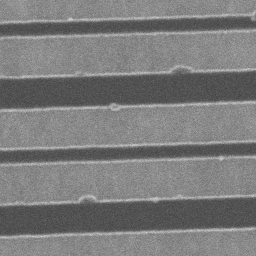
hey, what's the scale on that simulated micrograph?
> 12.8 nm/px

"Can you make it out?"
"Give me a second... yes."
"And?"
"lines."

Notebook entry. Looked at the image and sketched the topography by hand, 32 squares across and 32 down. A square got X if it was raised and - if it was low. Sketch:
--------------------------------
--------------------------------
--------X-XXXXXXXXXXXXXXXXXXXXXX
XXXXXXXXXXXXXXXXXXXXXXXXXXXXXXXX
XXXXXXXXX-----------------------
--------------------------------
--------------------------------
--------------------------------
----------------------XX--------
------XXXXXXXXXXXXXXXXXXXXXXXXXX
XXXXXXXXXXXXXXXXXXXXXXXXXXXXXXXX
XXXXXXXXXXXXXXXXXXXXXXXXXXXXXXXX
XXXXXXXXXXXXXXXXXXXXXXXXXXXXXXXX
XXXXXXXXXXXX-XX-----------------
--------------------------------
--------------------------------
--------------------------------
--------------------------------
----XXXXXXXXXXXXXXXXXXXXXXXXXXXX
XXXXXXXXXXXXXXXXXXXXXXXXXXXXXXXX
XXXX----------------------------
--------------------------------
--------------------------------
--------------------------------
-------------------------------X
----XXXXXXXXXXXXXXXXXXXXXXXXXXXX
XXXXXXXXXXXXXXXXXXXXXXXXXXXXXXXX
XXXXXXXXXXXXXXXXXXXXXXXXXXXXXXXX
XXXXXXXXXXXXXXXXXXXXXXXXXXXXXXXX
XXXXXX--------------------------
--------------------------------
--------------------------------